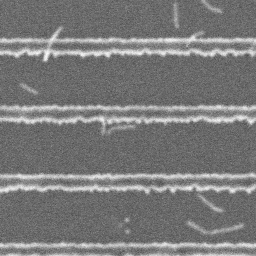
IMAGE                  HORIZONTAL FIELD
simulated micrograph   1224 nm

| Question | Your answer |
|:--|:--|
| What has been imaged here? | lines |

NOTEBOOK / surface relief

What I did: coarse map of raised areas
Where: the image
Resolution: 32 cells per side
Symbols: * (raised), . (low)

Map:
................................
................................
................................
................................
................................
********************************
********************************
................................
................................
................................
................................
................................
................................
***************.****************
********************************
................................
................................
................................
................................
................................
................................
................................
********************************
********************************
................................
................................
................................
................................
................................
................................
.**.*..*...........**..***.**.*.
********************************